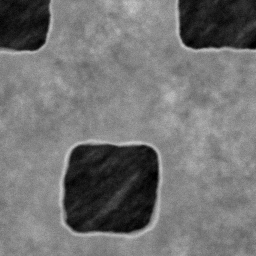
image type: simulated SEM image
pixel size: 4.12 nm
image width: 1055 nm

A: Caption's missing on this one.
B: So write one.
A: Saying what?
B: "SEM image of holes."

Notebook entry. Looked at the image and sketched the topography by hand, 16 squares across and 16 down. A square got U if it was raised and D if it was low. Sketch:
DDDUUUUUUUUDDDDD
DDDUUUUUUUUDDDDD
DDDUUUUUUUUDDDDD
UUUUUUUUUUUUUUUU
UUUUUUUUUUUUUUUU
UUUUUUUUUUUUUUUU
UUUUUUUUUUUUUUUU
UUUUUUUUUUUUUUUU
UUUUUUUUUUUUUUUU
UUUUDDDDDDUUUUUU
UUUUDDDDDDUUUUUU
UUUUDDDDDDUUUUUU
UUUUDDDDDDUUUUUU
UUUUDDDDDDUUUUUU
UUUUUDDDDUUUUUUU
UUUUUUUUUUUUUUUU